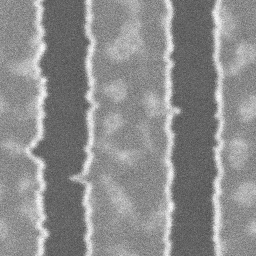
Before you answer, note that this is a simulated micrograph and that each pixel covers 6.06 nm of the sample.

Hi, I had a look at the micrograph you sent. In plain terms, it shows one or a few lines or trenches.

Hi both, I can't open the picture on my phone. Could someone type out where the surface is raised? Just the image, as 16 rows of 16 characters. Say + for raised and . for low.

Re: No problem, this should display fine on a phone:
++....+++++...++
++...++++++...++
+++...+++++...++
++....+++++...++
++....+++++...++
+++...+++++...++
+++...+++++...++
+++...+++++...++
++....+++++...++
++....+++++...++
+++..++++++...++
+++..++++++...++
++...++++++..+++
+++...+++++...++
+++...++++....++
+++...++++....++